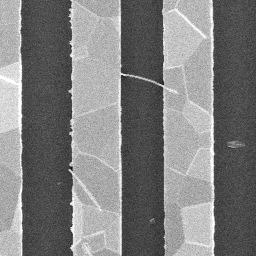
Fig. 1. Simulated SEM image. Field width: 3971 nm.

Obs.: lines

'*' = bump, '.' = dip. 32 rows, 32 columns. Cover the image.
**.......******.....******......
**.......******.....******......
**.......******.....*******.....
**.......******.....*******.....
***......******.....*******.....
***......******.....*******.....
**.......******.....*******.....
**.......******.....*******.....
**.......******.....*******.....
***......******.....*******.....
***......******.....*******.....
***......******.....*******.....
***......******.....*******.....
**.......******.....*******.....
***......******.....*******.....
***......******.....*******.....
***......******.....*******.....
***......******.....*******.....
***......******......******.....
***......******.....*******.....
***......******......******.....
***......******......******.....
***......******......******.....
***......******......******.....
***......******......******.....
***......******......******.....
***......******......******.....
***......******......******.....
***......******......******.....
***......******......******.....
***......******......******.....
***......******......******.....